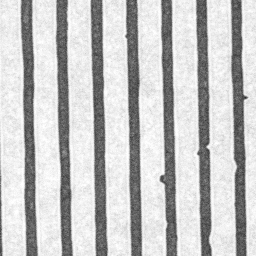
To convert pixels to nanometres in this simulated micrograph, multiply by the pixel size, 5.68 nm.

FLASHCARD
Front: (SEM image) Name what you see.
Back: parallel lines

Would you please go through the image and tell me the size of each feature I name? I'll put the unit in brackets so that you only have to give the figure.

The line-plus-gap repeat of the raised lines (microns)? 0.199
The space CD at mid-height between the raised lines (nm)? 76.7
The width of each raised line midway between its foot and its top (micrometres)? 0.123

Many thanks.